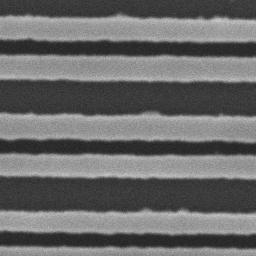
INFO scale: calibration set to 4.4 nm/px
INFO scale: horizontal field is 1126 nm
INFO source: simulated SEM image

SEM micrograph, lines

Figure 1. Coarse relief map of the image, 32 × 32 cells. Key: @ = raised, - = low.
--------------------------------
--------------------------------
@@@@@@@@@@@@@@@@@@@@@@@@@-@@@@@-
@@@@@@@@@@@@@@@@@@@@@@@@@@@@@@@@
@@@@@@@@@@@@@@@@@@@@@@@@@@@@@@@@
--------------------------------
--------------------------------
@@@@@@@@@@@@@@@@@@@@@@@@@@@@@@@@
@@@@@@@@@@@@@@@@@@@@@@@@@@@@@@@@
@@@@@@@@@@@@@@@@@@@@@@@@@@@@@@@@
--------------------------------
--------------------------------
--------------------------------
--------------------------------
@@@@@@@@@@@-@@@@@@@@--@---------
@@@@@@@@@@@@@@@@@@@@@@@@@@@@@@@@
@@@@@@@@@@@@@@@@@@@@@@@@@@@@@@@@
-------------@-@--@-@@@@@@@@@@@@
--------------------------------
@@@@@@@@@@@@@@@@@---@@----@@@@@@
@@@@@@@@@@@@@@@@@@@@@@@@@@@@@@@@
@@@@@@@@@@@@@@@@@@@@@@@@@@@@@@@@
--------------------------------
--------------------------------
--------------------------------
--------------------------------
@@@--@@-@@@-------@---@---------
@@@@@@@@@@@@@@@@@@@@@@@@@@@@@@@@
@@@@@@@@@@@@@@@@@@@@@@@@@@@@@@@@
--------------------------------
--------------------------------
@@@@@@@@@@@@@@@@@@@@@@@@@@@@@@@@